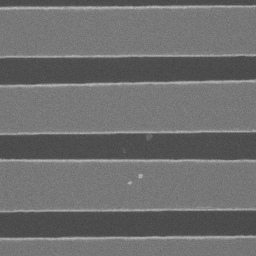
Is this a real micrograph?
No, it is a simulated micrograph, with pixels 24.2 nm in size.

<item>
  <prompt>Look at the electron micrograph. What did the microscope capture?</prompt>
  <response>lines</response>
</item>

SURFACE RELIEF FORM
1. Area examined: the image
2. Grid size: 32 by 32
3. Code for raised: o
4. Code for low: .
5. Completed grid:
................................
oooooooooooooooooooooooooooooooo
oooooooooooooooooooooooooooooooo
oooooooooooooooooooooooooooooooo
oooooooooooooooooooooooooooooooo
oooooooooooooooooooooooooooooooo
oooooooooooooooooooooooooooooooo
................................
................................
................................
...........ooooooooooooooooooooo
oooooooooooooooooooooooooooooooo
oooooooooooooooooooooooooooooooo
oooooooooooooooooooooooooooooooo
oooooooooooooooooooooooooooooooo
oooooooooooooooooooooooooooooooo
ooooooooooooooooooooooooo.......
................................
................................
................................
oooooooooooooooooooooooooooooooo
oooooooooooooooooooooooooooooooo
oooooooooooooooooooooooooooooooo
oooooooooooooooooooooooooooooooo
oooooooooooooooooooooooooooooooo
oooooooooooooooooooooooooooooooo
................................
................................
................................
................................
oooooooooooooooooooooooooooooooo
oooooooooooooooooooooooooooooooo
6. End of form